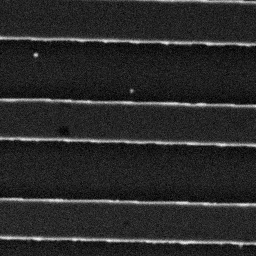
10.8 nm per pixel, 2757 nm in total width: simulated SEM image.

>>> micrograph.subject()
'lines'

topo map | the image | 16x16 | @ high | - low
@@@@@@@@@@@@@@@@
@@@@@@@@@@@@@@@@
----@@@@@@@@@@@@
----------------
----------------
----------------
@@@@@@@@@@@@@---
@@@@@@@@@@@@@@@@
@@@@@@@@@@@@@@@@
----------------
----------------
----------------
@@@@------------
@@@@@@@@@@@@@@@@
@@@@@@@@@@@@@@@@
----------------